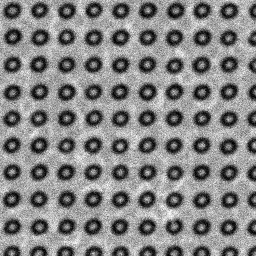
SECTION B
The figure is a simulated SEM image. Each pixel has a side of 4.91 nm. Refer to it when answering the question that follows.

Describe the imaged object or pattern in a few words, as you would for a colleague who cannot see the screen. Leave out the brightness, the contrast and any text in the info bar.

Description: a regular array of ring-shaped grooves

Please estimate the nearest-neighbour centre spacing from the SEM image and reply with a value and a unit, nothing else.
130 nm